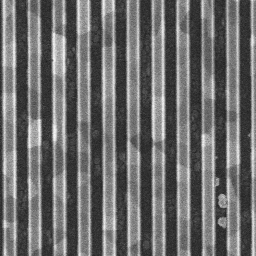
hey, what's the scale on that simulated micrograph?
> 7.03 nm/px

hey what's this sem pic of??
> parallel lines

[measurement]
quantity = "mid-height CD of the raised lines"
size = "72.9 nm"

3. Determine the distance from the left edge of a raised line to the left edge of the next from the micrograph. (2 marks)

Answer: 175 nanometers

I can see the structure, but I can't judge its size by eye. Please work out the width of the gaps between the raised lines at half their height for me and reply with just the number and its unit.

96.7 nanometers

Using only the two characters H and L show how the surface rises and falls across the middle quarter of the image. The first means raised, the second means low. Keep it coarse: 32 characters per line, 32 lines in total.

LLLLHHLLLLHHLLLLHHHLLLHHHLLLHHHL
LLLLHHLLLLHHLLLLHHHLLLHHHLLLHHHL
LLLLHHLLLLHHLLLLHHHLLLHHHLLLLHHL
LLLLHHLLLLHHLLLLHHHLLLHHHLLLLHHL
LLLLHHLLLLHHLLLLHHHLLLHHHLLLLHHL
LLLLHHLLLLHHLLLLHHHLLLHHHLLLLHHL
LLLLHHLLLLHHLLLLHHHLLLHHHLLLLHHL
LLLLHHLLLLHHLLLLHHHLLLHHHLLLLHHL
LLLLHHLLLLHHLLLLHHHLLLHHHLLLLHHL
LLLLHHLLLLHHLLLLHHHLLLHHHLLLLHHL
LLLLHHLLLLHHLLLLHHHLLLHHHLLLLHHL
LLLLHHLLLLHHLLLLHHHLLLHHHLLLLHHL
LLLLHHLLLLHHLLLLHHHLLLHHHLLLLHHL
LLLLHHLLLLHHLLLLHHHLLLHHHLLLLHHL
LLLLHHLLLLHHLLLLHHHLLLHHHLLLLHHL
LLLLHHLLLLHHLLLLHHHLLLHHHLLLLHHL
LLLLHHLLLLHHLLLLHHHLLLHHHLLLLHHL
LLLLHHLLLLHHLLLLHHHLLLHHHLLLLHHL
LLLLHHLLLLHHLLLLHHHLLLHHHLLLLHHL
LLLLHHLLLLHHLLLLHHHLLLHHHLLLLHHL
LLLLHHLLLLHHLLLLHHHLLLHHHLLLLHHL
LLLLHHLLLLHHLLLLHHHLLLHHHLLLLHHL
LLLLHHLLLLHHLLLLHHHLLLHHHLLLLHHL
LLLLHHLLLLHHLLLLHHHLLLHHHLLLLHHL
LLLLHHLLLLHHLLLLHHHLLLHHHLLLLHHL
LLLLHHLLLLHHLLLLHHHLLLHHHLLLLHHL
LLLLHHLLLLHHLLLLHHHLLLHHHLLLLHHL
LLLLHHLLLLHHLLLLHHHLLLHHHLLLLHHL
LLLLHHLLLLHHLLLLHHHLLLHHHLLLLHHL
LLLLHHLLLLHHLLLLHHHLLLHHHLLLLHHL
LLLLHHLLLLHHLLLLHHHLLLHHHLLLLHHL
LLLLHHLLLLHHLLLLHHHLLLHHHLLLLHHL